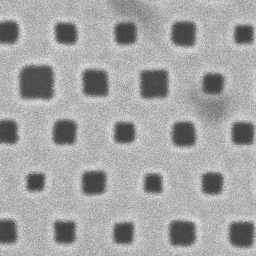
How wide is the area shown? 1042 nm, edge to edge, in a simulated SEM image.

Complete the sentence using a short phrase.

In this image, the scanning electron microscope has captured a regular array of holes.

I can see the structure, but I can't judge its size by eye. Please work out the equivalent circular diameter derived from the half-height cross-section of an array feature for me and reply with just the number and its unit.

102 nm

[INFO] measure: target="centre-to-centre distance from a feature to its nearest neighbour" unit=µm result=0.235